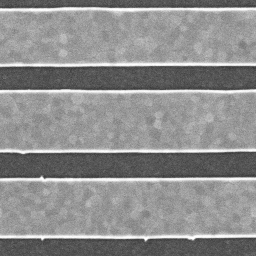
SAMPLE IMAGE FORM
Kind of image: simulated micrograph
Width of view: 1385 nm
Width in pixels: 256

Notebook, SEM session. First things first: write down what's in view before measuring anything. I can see one or a few lines or trenches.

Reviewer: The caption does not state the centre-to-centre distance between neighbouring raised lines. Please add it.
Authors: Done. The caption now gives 463 nm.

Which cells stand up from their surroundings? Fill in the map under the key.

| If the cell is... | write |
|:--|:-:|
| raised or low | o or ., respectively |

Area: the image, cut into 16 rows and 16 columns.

................
oooooooooooooooo
oooooooooooooooo
oooooooooooooooo
................
................
oooooooooooooooo
oooooooooooooooo
oooooooooooooooo
.o..............
................
oooooooooooooooo
oooooooooooooooo
oooooooooooooooo
oooooooooooooooo
................